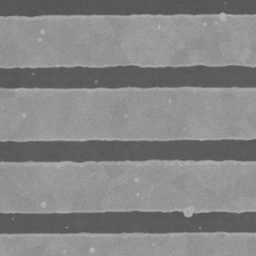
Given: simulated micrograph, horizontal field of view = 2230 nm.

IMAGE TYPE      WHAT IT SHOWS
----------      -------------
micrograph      lines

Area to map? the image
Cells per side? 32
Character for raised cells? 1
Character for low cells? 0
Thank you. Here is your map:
00000000000000000000000000000000
00000000000000000000000000000000
11111111111111111111111111111111
11111111111111111111111111111111
11111111111111111111111111111111
11111111111111111111111111111111
11111111111111111111111111111111
11111111111111111111111111111111
00000000000000000000000000000000
00000000000000000000000000000000
00000000000000000000000000000000
11111111111111111111111111111111
11111111111111111111111111111111
11111111111111111111111111111111
11111111111111111111111111111111
11111111111111111111111111111111
11111111111111111111111111111111
11111111111001111111110001000000
00000000000000000000000000000000
00000000000000000000000000000000
11111111111111111111111111111111
11111111111111111111111111111111
11111111111111111111111111111111
11111111111111111111111111111111
11111111111111111111111111111111
11111111111111111111111111111111
11111111100000000000000110000100
00000000000000000000000000000000
00000000000000000000000000000000
11111111111111111111111111111111
11111111111111111111111111111111
11111111111111111111111111111111